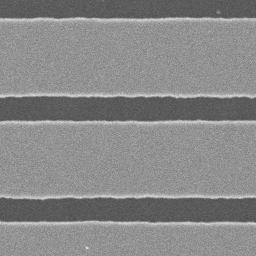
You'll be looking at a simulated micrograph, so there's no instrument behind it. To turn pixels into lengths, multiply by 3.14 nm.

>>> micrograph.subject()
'lines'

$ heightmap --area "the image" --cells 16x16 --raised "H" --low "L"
LLLLLLLLLLLLLLLL
HHHHHHHHHHHHHHHH
HHHHHHHHHHHHHHHH
HHHHHHHHHHHHHHHH
HHHHHHHHHHHHHHHH
HHHHHHHHHHHHHHHH
LLLLLLLLLLLLLLLL
LLLLLLLLLLLLLLLL
HHHHHHHHHHHHHHHH
HHHHHHHHHHHHHHHH
HHHHHHHHHHHHHHHH
HHHHHHHHHHHHHHHH
LLLLLLLLLLLLLLLL
LLLLLLLLLLLLLLLL
HHHHHHHHHHHHHHHH
HHHHHHHHHHHHHHHH